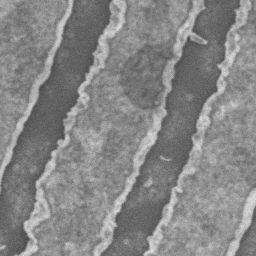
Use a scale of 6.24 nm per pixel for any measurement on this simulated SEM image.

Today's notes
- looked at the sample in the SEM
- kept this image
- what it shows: one or a few lines or trenches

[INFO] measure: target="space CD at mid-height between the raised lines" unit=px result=42.4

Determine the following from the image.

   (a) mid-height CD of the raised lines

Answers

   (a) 499 nanometers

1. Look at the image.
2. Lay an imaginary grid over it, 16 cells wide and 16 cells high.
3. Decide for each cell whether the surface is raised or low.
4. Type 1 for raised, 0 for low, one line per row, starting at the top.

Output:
1111000111110001
1111000111110001
1111001111110011
1110001111100011
1110001111100011
1100011111100011
1100011111000111
1100111111000111
1000111111001111
1001111110001111
0001111110001111
0011111100011111
0011111100011111
0011111000111111
0011111000111110
0011111001111110